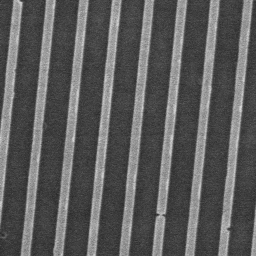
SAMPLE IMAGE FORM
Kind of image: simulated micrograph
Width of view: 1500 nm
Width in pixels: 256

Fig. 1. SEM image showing parallel lines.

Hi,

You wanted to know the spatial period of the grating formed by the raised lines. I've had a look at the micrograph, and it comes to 192 nanometres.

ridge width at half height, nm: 49.5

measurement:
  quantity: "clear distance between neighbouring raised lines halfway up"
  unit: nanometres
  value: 142